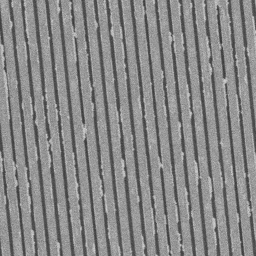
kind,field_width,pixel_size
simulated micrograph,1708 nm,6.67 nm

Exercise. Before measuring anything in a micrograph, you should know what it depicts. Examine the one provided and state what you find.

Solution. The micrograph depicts parallel lines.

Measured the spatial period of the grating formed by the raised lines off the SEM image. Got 0.0805 microns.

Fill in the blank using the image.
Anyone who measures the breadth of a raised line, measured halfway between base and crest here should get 62.2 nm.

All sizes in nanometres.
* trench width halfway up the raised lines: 19.1